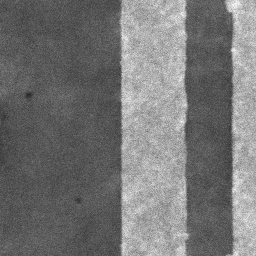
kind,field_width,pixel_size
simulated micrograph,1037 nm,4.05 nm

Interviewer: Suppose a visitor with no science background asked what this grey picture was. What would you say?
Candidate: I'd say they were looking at one or a few lines or trenches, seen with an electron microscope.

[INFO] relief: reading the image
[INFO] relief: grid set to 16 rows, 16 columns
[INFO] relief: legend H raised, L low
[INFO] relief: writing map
LLLLLLLLHHHHLLHH
LLLLLLLLHHHLLLLH
LLLLLLLLHHHHLLLH
LLLLLLLLHHHHLLLH
LLLLLLLLHHHHLLLH
LLLLLLLLHHHHLLLH
LLLLLLLLHHHHLLLH
LLLLLLLLHHHHLLLH
LLLLLLLLHHHHLLLH
LLLLLLLLHHHHLLLH
LLLLLLLLHHHHLLLH
LLLLLLLLHHHHLLLH
LLLLLLLLHHHHLLLH
LLLLLLLLHHHHLLLH
LLLLLLLLHHHHLLLH
LLLLLLLLHHHHLLLH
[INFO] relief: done